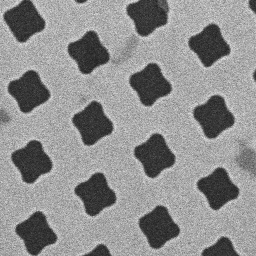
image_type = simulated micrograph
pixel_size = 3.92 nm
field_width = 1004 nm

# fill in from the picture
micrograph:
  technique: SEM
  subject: a regular array of holes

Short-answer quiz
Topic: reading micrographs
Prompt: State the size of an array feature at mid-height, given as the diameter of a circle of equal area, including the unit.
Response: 0.149 microns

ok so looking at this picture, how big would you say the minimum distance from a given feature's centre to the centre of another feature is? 275 nm